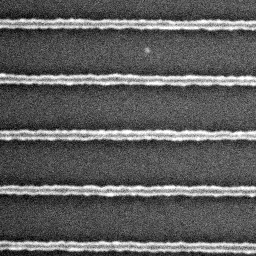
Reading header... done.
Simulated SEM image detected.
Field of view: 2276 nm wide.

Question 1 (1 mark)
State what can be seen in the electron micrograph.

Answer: lines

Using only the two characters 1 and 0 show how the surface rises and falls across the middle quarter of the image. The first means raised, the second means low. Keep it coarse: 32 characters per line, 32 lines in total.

00000000000000000000000000000000
00000000000000000000000000000000
00000000000000000000000000000000
11111111111111111111111111111111
11111111111111111111111111111111
00000000000000000000000000000000
00000000000000000000000000000000
00000000000000000000000000000000
00000000000000000000000000000000
00000000000000000000000000000000
00000000000000000000000000000000
00000000000000000000000000000000
00000000000000000000000000000000
00000000000000000000000000000000
00000000000000000000000000000000
00000000000000000000000000000000
00000000000000000000000000000000
11111111111111111111111111111111
11111111111111111111111111111111
00000000000000000000000000000000
00000000000000000000000000000000
00000000000000000000000000000000
00000000000000000000000000000000
00000000000000000000000000000000
00000000000000000000000000000000
00000000000000000000000000000000
00000000000000000000000000000000
00000000000000000000000000000000
00000000000000000000000000000000
00000000000000000000000000000000
00000000000000000000000000000000
11111111111111111111111111111111